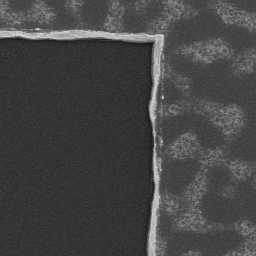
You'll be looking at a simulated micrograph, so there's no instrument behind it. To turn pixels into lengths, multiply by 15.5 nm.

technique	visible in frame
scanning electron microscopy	one or a few lines or trenches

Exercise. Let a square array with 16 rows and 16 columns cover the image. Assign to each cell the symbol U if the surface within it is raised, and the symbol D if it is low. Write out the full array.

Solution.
UUUUUUUUUUUUUUUU
UUUUUUUUUUUUUUUU
DDDDDDDDDDUUUUUU
DDDDDDDDDDUUUUUU
DDDDDDDDDDUUUUUU
DDDDDDDDDDUUUUUU
DDDDDDDDDDUUUUUU
DDDDDDDDDDUUUUUU
DDDDDDDDDDUUUUUU
DDDDDDDDDDUUUUUU
DDDDDDDDDDUUUUUU
DDDDDDDDDDUUUUUU
DDDDDDDDDDUUUUUU
DDDDDDDDDDUUUUUU
DDDDDDDDDDUUUUUU
DDDDDDDDDUUUUUUU